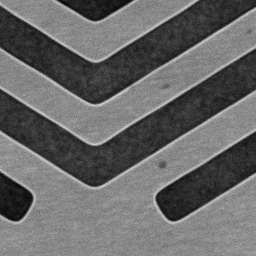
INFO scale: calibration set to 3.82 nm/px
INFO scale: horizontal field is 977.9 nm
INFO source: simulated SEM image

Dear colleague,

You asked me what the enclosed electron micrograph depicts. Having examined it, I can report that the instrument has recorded groups of lines, slits or small figures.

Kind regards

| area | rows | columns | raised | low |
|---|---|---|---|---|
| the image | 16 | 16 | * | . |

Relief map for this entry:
****....****....
..********....**
...*****.....***
*....**....****.
**.......*****..
****....****....
..********.....*
...******....***
.....**....****.
**........****..
****....****....
.****..****....*
..********...***
.*********..****
****************
****************